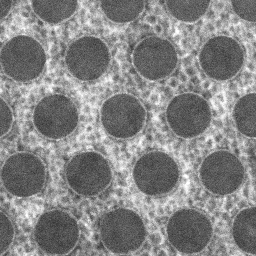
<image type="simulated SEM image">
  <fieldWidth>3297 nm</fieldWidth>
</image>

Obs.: a regular array of raised bodies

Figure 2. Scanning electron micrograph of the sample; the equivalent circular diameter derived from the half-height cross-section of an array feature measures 600 nanometres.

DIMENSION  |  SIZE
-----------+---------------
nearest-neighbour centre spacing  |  850 nanometres